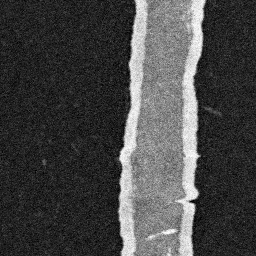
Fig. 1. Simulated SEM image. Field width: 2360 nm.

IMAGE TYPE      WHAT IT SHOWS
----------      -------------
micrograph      one or a few lines or trenches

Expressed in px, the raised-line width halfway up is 59.5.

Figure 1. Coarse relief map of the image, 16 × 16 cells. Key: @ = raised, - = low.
---------@@@----
---------@@@----
---------@@@----
--------@@@@----
--------@@@@----
--------@@@@----
--------@@@@----
--------@@@@----
--------@@@@----
--------@@@@----
--------@@@@----
--------@@@@----
--------@@@@----
--------@@@@----
--------@@@@----
--------@@@@----